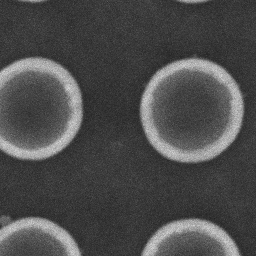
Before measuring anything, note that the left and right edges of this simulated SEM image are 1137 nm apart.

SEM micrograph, raised bodies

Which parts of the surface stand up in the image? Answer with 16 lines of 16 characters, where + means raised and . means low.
................
................
................
................
++++......++++..
+++++....++++++.
+++++....++++++.
+++++....++++++.
++++.....+++++..
.++.......+++...
................
................
................
................
++++......++++..
+++++....+++++..